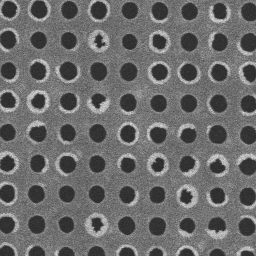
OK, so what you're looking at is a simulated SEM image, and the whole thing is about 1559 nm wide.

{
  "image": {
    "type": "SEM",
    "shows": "a regular array of holes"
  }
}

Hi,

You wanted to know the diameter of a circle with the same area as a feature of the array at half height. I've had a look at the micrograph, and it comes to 0.101 microns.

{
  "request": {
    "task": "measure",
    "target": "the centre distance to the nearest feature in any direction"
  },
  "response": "181 nm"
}